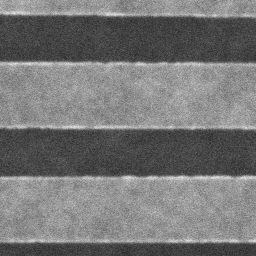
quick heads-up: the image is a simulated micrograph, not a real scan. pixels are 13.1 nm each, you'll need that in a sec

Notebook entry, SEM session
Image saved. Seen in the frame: lines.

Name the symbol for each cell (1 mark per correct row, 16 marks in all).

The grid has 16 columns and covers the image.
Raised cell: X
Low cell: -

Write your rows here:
XXXXXXXXXXXXXXXX
----------------
----------------
----------------
XXXXXXXXXXXXXXXX
XXXXXXXXXXXXXXXX
XXXXXXXXXXXXXXXX
XXXXXXXXXXXXXXXX
----------------
----------------
----------------
XXXXXXXXXXXXXXXX
XXXXXXXXXXXXXXXX
XXXXXXXXXXXXXXXX
XXXXXXXXXXXXXXXX
----------------